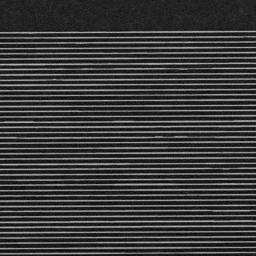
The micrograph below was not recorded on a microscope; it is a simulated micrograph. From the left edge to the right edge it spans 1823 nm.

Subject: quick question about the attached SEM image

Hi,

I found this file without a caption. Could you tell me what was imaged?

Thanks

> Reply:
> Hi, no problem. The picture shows parallel lines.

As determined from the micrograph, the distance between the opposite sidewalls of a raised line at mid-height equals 0.0089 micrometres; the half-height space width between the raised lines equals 30.3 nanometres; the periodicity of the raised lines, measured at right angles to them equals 37.5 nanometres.